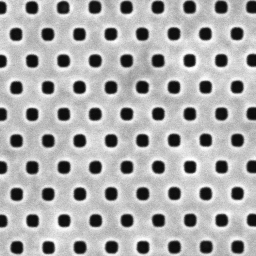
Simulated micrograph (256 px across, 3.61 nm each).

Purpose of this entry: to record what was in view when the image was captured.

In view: a regular array of holes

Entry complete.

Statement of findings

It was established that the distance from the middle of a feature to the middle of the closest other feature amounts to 111 nanometers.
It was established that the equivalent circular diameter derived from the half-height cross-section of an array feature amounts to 14.1 pixels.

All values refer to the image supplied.